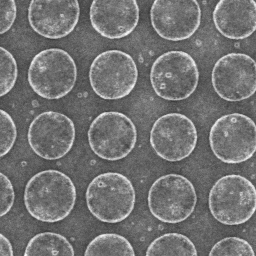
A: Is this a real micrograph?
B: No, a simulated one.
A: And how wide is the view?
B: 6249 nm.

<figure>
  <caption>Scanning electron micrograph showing a regular array of raised bodies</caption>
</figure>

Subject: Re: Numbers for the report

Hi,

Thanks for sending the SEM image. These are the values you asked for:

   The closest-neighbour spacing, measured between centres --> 1.48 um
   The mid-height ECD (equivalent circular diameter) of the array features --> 1150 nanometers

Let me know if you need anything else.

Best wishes